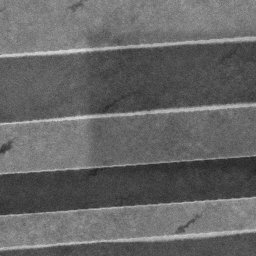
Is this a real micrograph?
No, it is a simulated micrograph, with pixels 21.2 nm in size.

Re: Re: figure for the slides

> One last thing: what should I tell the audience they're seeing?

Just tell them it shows lines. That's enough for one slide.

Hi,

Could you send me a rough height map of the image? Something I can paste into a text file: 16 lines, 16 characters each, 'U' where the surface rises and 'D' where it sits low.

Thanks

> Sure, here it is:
UUUUUUUUUUUUUUUU
UUUUUUUUUUUUUUUU
UUUUUUUUUUUUUUDD
DDDDDDDDDDDDDDDD
DDDDDDDDDDDDDDDD
DDDDDDDDDDDDDDDD
DDDDDDDDDDDDDDDD
DDDUUUUUUUUUUUUU
UUUUUUUUUUUUUUUU
UUUUUUUUUUUUUUUU
UUUUUDDDDDDDDDDD
DDDDDDDDDDDDDDDD
DDDDDDDDDDDDDDUU
UUUUUUUUUUUUUUUU
UUUUUUUUUUUUUUDD
UDDDDDDDDDDDDDDD